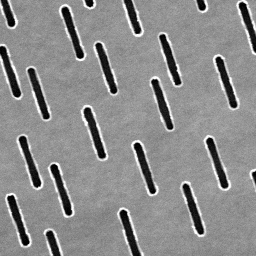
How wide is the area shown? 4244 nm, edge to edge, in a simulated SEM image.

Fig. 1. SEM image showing a regular array of holes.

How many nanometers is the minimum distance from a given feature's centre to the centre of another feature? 863